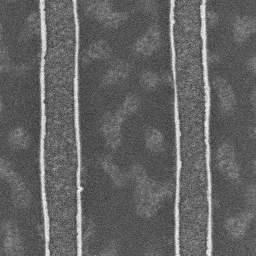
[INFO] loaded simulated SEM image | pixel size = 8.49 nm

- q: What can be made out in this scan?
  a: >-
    one or a few lines or trenches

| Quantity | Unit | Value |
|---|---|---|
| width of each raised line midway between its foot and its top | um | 0.289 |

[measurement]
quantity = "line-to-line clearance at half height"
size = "822 nanometers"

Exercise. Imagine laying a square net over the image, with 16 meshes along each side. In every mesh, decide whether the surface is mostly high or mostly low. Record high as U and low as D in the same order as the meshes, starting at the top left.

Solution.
DDDUUDDDDDDUUDDD
DDDUUDDDDDDUUDDD
DDDUUDDDDDDUUDDD
DDDUUDDDDDDUUDDD
DDDUUDDDDDDUUDDD
DDDUUDDDDDDUUDDD
DDDUUDDDDDDUUDDD
DDDUUDDDDDDUUDDD
DDDUUDDDDDDUUDDD
DDDUUDDDDDDUUDDD
DDDUUDDDDDDUUDDD
DDDUUDDDDDDUUDDD
DDDUUDDDDDDUUDDD
DDDUUDDDDDDUUDDD
DDDUUDDDDDDUUDDD
DDDUUDDDDDDUUDDD